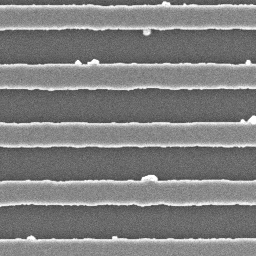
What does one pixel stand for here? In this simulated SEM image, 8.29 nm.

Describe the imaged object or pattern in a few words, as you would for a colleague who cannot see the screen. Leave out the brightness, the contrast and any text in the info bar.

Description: lines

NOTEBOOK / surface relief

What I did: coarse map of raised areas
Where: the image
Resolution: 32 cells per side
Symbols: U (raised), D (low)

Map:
DDDDDDDDDDDDDDDDDDDDDDDDDDDDDDDD
UUUUUUUUUUUUUUUUUUUUUUUUUUUUUUUU
UUUUUUUUUUUUUUUUUUUUUUUUUUUUUUUU
UUUUUUUUUUUUUUUUUUUUUUUUUUDUUDUU
DDDDDDDDDDDDDDDDDDDDDDDDDDDDDDDD
DDDDDDDDDDDDDDDDDDDDDDDDDDDDDDDD
DDDDDDDDDDDDDDDDDDDDDDDDDDDDDDDD
DDDDDDDDDDDDDDDDDDDDDDDDDDDDDDDD
UUUUUUUUUUUUUUUUUUUUUUUUUUUUUUUU
UUUUUUUUUUUUUUUUUUUUUUUUUUUUUUUU
UUUUUUUUUUUUUUUUUUUUUUUUUUUUUUUU
DDDDDDDDDDDDDDDDDDDDDDDDDDDDDDDD
DDDDDDDDDDDDDDDDDDDDDDDDDDDDDDDD
DDDDDDDDDDDDDDDDDDDDDDDDDDDDDDDD
DDDDDDDDDDDDDDDDDDDDDDDDDDDDDDDD
UUUUUUUUUUUUUUUUUUUUUUUUUUUUUUUU
UUUUUUUUUUUUUUUUUUUUUUUUUUUUUUUU
UUUUUUUUUUUUUUUUUUUUUUUUUUUUUUUU
DDDDDDDDDDDDDDDDDDDDDDDDDDDDDDDD
DDDDDDDDDDDDDDDDDDDDDDDDDDDDDDDD
DDDDDDDDDDDDDDDDDDDDDDDDDDDDDDDD
DDDDDDDDDDDDDDDDDDDDDDDDDDDDDDDD
DDDDDDDDDDDDDDDDDDUUDDDDDDDDDDDD
UUUUUUUUUUUUUUUUUUUUUUUUUUUUUUUU
UUUUUUUUUUUUUUUUUUUUUUUUUUUUUUUU
UUUUUUUUUUUUUUUUUUUUUUUUUUUUUUUU
DDDDDDDDDDDDDDDDDDDDDDDDDDDDDDDD
DDDDDDDDDDDDDDDDDDDDDDDDDDDDDDDD
DDDDDDDDDDDDDDDDDDDDDDDDDDDDDDDD
DDDDDDDDDDDDDDDDDDDDDDDDDDDDDDDD
UUUUUUUUUUUUUUUUUUUUUUUUUUUUUUUU
UUUUUUUUUUUUUUUUUUUUUUUUUUUUUUUU